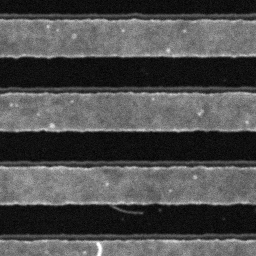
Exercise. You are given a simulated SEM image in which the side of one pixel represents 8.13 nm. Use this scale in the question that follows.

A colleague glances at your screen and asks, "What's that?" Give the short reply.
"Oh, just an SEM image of lines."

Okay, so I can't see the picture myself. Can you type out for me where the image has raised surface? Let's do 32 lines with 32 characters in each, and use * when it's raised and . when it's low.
................................
................................
..*.........*...*...............
********************************
********************************
********************************
********************************
................................
................................
................................
................................
................................
********************************
********************************
********************************
********************************
................................
................................
................................
................................
................................
********************************
********************************
********************************
********************************
********..*...*..**..**...***...
................................
................................
................................
................................
********************************
********************************